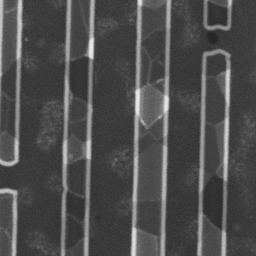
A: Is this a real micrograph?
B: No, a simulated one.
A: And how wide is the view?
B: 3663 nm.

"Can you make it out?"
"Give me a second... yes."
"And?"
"one or a few lines or trenches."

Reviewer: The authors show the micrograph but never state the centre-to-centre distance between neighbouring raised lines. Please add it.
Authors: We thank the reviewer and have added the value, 988 nm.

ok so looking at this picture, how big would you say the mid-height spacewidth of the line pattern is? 678 nanometres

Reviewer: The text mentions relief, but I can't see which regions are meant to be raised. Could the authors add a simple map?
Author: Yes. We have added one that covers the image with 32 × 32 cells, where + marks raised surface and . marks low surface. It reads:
++.......+++.....++++.....+++...
++.......++......++++.....+++...
++.......++......++++.....+++...
++.......++......++++...........
++.......++......++++...........
++......+++......++++...........
++......+++......++++......+....
++.......++......++++.....++....
++.......++......++++.....++....
++......+++......++++.....++....
++......+++......++++....+++....
++......+++......++++....+++....
++......+++......++++....+++....
++......+++......++++....+++....
++......+++......++++....+++....
++......+++......++++....+++....
++......+++......++++....+++....
++......+++......++++....+++....
++......+++......++++....+++....
++......+++......++++....+++....
........+++......++++....+++....
........+++......+++.....+++....
........+++......+++.....+++....
........+++......+++.....+++....
++......+++......+++.....+++....
++......+++......+++.....+++....
++......+++......+++.....+++....
++......+++......+++.....+++....
++......+++......+++.....+++....
++......+++......+++.....+++....
++......+++......+++.....+++....
++......+++......+++.....+++....